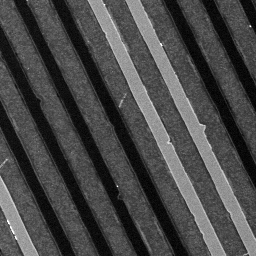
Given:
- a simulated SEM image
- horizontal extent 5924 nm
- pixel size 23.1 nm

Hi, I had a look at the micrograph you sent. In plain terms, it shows parallel lines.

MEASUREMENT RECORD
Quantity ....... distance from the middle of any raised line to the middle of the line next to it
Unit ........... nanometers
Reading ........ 780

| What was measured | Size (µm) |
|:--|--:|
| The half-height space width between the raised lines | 0.489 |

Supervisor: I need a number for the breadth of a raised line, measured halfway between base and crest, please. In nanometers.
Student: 294